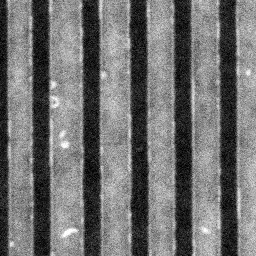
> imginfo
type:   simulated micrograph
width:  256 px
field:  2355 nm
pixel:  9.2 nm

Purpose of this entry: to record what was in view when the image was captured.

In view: lines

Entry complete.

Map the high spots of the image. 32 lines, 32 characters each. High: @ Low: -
@---@@----@@@---@@----@@---@@@--
@---@@----@@@---@@@---@@---@@@--
@---@@----@@@---@@@---@@---@@@--
@---@@----@@@---@@@---@@---@@@--
@---@@----@@@---@@@---@@---@@@--
@---@@----@@@---@@@---@@---@@@--
@---@@----@@@---@@@---@@---@@@--
@---@@----@@@---@@@---@@---@@@--
@---@@----@@@---@@@---@@---@@@--
@---@@----@@@---@@@---@@---@@@--
@---@@----@@@---@@@---@@---@@@--
@---@@----@@@---@@@---@@---@@@--
@---@@----@@@---@@@---@@---@@@--
@---@@----@@@---@@@---@@---@@@--
@---@@----@@@---@@@---@@---@@@--
@---@@----@@@---@@@---@@---@@@--
@---@@----@@@---@@@---@@---@@@--
@---@@----@@@---@@@---@@---@@@--
@---@@----@@@---@@@---@@---@@@--
@---@@----@@@---@@@---@@---@@@--
@---@@----@@@---@@@---@@---@@@--
@---@@----@@@---@@@---@@---@@@--
@---@@----@@@---@@@---@@---@@@--
@---@@----@@@---@@@---@@---@@@--
@---@@----@@@---@@@---@@---@@@--
@---@@----@@@---@@@---@@---@@@--
@---@@----@@@---@@@---@@---@@@--
@---@@----@@@---@@@---@@---@@@--
@---@@----@@@---@@@---@@---@@@--
@---@@----@@@---@@@---@@---@@@--
@---@@----@@@---@@@---@@---@@@--
@---@@----@@@---@@@---@@---@@@--